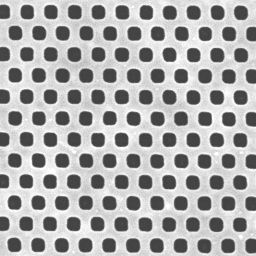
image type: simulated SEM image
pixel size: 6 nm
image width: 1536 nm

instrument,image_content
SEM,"a regular array of holes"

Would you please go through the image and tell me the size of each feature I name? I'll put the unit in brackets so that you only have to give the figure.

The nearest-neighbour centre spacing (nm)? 142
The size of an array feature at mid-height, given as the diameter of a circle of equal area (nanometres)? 92.3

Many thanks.